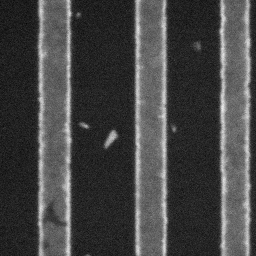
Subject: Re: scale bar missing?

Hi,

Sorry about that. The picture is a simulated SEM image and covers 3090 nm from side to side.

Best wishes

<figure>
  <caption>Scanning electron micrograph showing lines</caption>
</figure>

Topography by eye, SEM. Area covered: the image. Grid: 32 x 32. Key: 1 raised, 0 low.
00000111100000000111100000001110
00000111100000000111100000001110
00000111100000000111100000001110
00000111100000000111100000001110
00000111100000000111000000001110
00000111100000000111000000001110
00000111100000000111000000001110
00000111100000000111000000001110
00000111100000000111100000001110
00000111100000000111100000001110
00000111100000000111100000001110
00000111100000000111100000001110
00000111100000000111100000001110
00000111100000000111100000001110
00000111100000000111100000001110
00000111100000000111100000001110
00000111100000000111100000001110
00000111100000000111100000001110
00000111100000000111100000001110
00000111100000000111100000001110
00000111100000000111100000001110
00000111100000000111100000001110
00000111100000000111100000001110
00000111100000000111100000001110
00000111100000000111100000001110
00000111100000000111100000001110
00000111100000000111100000001110
00000111100000000111100000001110
00000111100000000111100000001110
00000111100000000111100000001110
00000111100000000111100000001110
00000111100000000111100000001110